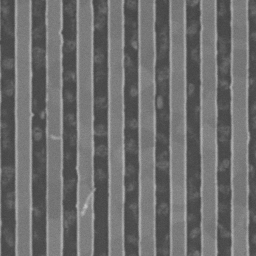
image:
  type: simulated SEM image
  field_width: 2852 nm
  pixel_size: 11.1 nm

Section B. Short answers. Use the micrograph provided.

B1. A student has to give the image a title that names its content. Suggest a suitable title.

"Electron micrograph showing parallel lines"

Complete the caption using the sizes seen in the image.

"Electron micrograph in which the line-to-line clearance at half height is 184 nanometers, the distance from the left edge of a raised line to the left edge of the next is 344 nanometers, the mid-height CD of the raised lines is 164 nm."